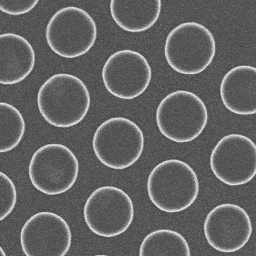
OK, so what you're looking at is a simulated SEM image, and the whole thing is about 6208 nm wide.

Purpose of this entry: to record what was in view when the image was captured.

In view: a regular array of raised bodies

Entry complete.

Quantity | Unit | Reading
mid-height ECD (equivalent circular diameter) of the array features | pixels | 48.8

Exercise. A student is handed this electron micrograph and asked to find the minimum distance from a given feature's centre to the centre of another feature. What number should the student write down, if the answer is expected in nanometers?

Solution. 1660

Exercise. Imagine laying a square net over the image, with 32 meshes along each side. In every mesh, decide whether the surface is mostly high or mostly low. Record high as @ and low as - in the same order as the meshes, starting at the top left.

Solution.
@@@@----------@@@@@@------------
-@@----@@@----@@@@@@------------
------@@@@@---@@@@@-------------
------@@@@@@----@@----@@@@------
@@----@@@@@@---------@@@@@------
@@@@--@@@@@@---------@@@@@@-----
@@@@---@@@@----@@----@@@@@@-----
@@@@----------@@@@---@@@@@------
@@@@---------@@@@@@---@@@@----@@
@@@----@@----@@@@@@---------@@@@
------@@@@---@@@@@----------@@@@
-----@@@@@@---@@@@----@-----@@@@
-----@@@@@@---------@@@@@---@@@@
@@---@@@@@@---------@@@@@@---@@@
@@@---@@@@----------@@@@@@------
@@@----@@----@@@@---@@@@@@------
@@@---------@@@@@@--@@@@@-------
@@----------@@@@@@----@@----@@@-
@----@@@----@@@@@@---------@@@@@
----@@@@@---@@@@@---------@@@@@@
----@@@@@@---@@@----@@@---@@@@@@
----@@@@@@---------@@@@@---@@@@@
@---@@@@@----------@@@@@@---@@@-
@@---@@@@----@-----@@@@@@-------
@@---------@@@@@---@@@@@--------
@@---------@@@@@---@@@@@--------
@----------@@@@@@---------@@@@@-
----@@@@---@@@@@----------@@@@@-
---@@@@@---@@@@@----------@@@@@-
---@@@@@@----------@@@----@@@@@-
---@@@@@@---------@@@@@---@@@@--
---@@@@@----------@@@@@@--------